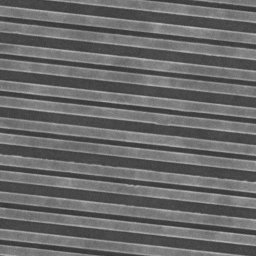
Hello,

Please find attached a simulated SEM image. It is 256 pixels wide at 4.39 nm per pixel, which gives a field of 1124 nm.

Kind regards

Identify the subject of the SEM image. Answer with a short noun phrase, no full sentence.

parallel lines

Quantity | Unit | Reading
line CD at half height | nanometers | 43.7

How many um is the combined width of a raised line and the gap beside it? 0.0812